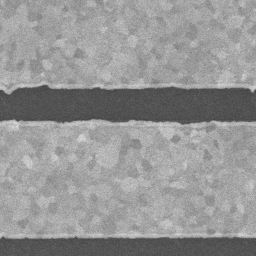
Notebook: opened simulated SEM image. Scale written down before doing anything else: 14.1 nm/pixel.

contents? one or a few lines or trenches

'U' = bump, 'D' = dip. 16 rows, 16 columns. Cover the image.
UUUUUUUUUUUUUUUU
UUUUUUUUUUUUUUUU
UUUUUUUUUUUUUUUU
UUUUUUUUUUUUUUUU
UUUUUUUUUUUUUUUU
UDDDDDDDDDDDDDDD
DDDDDDDDDDDDDDDD
DDDDDDDDDDDDDDDD
UUUUUUUUUUUUUUUU
UUUUUUUUUUUUUUUU
UUUUUUUUUUUUUUUU
UUUUUUUUUUUUUUUU
UUUUUUUUUUUUUUUU
UUUUUUUUUUUUUUUU
UUUUUUUUUUUUUUUU
DDDDDDDDDDDDDDDD